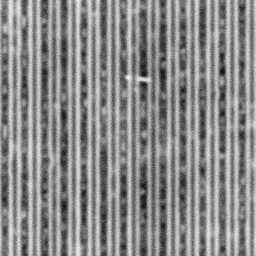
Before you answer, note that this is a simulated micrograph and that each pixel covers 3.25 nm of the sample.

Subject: parallel lines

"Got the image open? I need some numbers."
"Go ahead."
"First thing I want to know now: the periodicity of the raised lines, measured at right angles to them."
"0.0641 um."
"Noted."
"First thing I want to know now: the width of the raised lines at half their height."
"0.0329 micrometres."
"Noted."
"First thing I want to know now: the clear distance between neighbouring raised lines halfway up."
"32.9 nm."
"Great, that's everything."